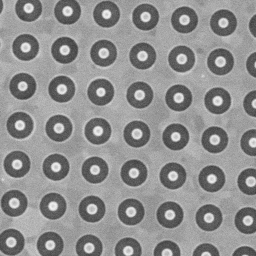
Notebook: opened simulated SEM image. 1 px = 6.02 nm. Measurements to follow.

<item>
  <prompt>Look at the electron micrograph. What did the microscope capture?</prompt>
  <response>an array of small figures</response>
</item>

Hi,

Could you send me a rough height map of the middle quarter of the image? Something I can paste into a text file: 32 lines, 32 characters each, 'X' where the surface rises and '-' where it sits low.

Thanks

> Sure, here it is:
XXXXXXXX---XXXXXX-----XXXX------
XXXXXXXXXXXXXXXXXXXXXXXXXXX-----
XXXXXXXXXXXXXXXXXXXXXXXXXXXXXXXX
-XXXXXXXX-XXXXXXXXXXXXXXXXXXXXXX
---XXXX-----XXXXXX--XXXXXXXXXXXX
---XXX------XXXX-----XXXXXX----X
X--XXX--XX---XXX------XXXX------
---XXX--XX---XX---XX--XXX---X---
--XXXX------XXXX--XX--XXX---XX--
-XXXXXX-----XXXX------XXX---X---
XXXXXXXX-XXXXXXXX----XXXXX------
XXXXXXXXXXXXXXXXXXXXXXXXXXX---XX
XXXXXXXXXXXXXXXXXXXXXXXXXXXXXXXX
-XXXXXX--XXXXXXXXXXXXXXXXXXXXXXX
--XXXX-----XXXXXX---XXXXXXXXXXXX
--XXX-------XXX------XXXXX----XX
--XXX--XX---XXX---X--XXXX------X
--XXX---X---XXX--XX---XXX--XX--X
-XXXX------XXXX---X---XX---XX--X
XXXXXX-----XXXX------XXXX------X
XXXXXXXXXXXXXXXX----XXXXX------X
XXXXXXXXXXXXXXXXXXXXXXXXXXX--XXX
XXXXXXXXXXXXXXXXXXXXXXXXXXXXXXXX
-XXXXX----XXXXXXXXXXXXXXXXXXXXXX
-XXXX------XXXX-----XXXXXXXXXXXX
-XXX---X---XXXX------XXXX-----XX
-XXX---XX--XXX---X---XXX------XX
-XXX---X---XXX--XX---XXX--XX---X
XXXXX------XXX-------XXX--XX---X
XXXXXX---XXXXXX-----XXXX------XX
XXXXXXXXXXXXXXXXX--XXXXXX----XXX
XXXXXXXXXXXXXXXXXXXXXXXXXXX-XXXX